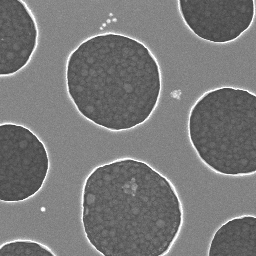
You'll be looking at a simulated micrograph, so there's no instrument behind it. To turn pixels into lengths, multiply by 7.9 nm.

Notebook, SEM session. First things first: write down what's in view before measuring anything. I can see holes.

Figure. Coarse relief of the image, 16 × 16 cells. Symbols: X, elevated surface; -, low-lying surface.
--XXXXXXXXX-----
--XXXXXXXXXX----
--XXXX--XXXXX-XX
--XX-----XXXXXXX
-XXX------XXXXXX
XXXX------XXXXXX
XXXXX-----XX----
XXXXXX---XXX----
--XXXXXXXXXX----
---XXXXXXXXX----
---XXX---XXXX---
---XX------XXXXX
-XXXX------XXXXX
XXXXX------XXXXX
XXXXX------XXX--
---XXX-----XX---